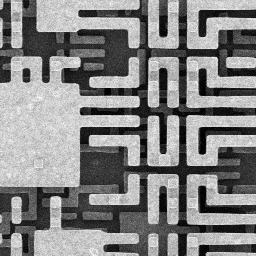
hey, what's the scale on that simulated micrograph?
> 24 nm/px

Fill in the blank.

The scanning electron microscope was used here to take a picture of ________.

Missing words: wiring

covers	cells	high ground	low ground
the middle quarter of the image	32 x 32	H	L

HHHHLLLLLLLLLLLLHHHLLHHHHHHHHLLH
LLLLLLLLLLLLLLLLHHHLLHHHLLHHHLLH
LLLLLLLLLLLLLLLLHHHLLHHHLLHHHLLH
LLLLLLLHHHHHHHHHHHHLLHHHLLHHHLLH
LLLLLLHHHHHHHHHHHHHLLHHHLLHHHLLH
HHHHLLLHHHHHHHHHHHHLLHHHLLHHHLLH
HHHHLLLLLLLLLLLLLLLLLHHHLLHHHLLH
HHHHLLLLLLLLLLLLLLLLLHHHLLHHHLLH
HHHHHHHHHHHHHHHHHHHLLHHHLLHHHLLH
HHHHHHHHHHHHHHHHHHHLLHHHLLHHHLLH
HHHHHHHHHHHHHHHHHHHLLHHHLLHHHLLH
HHHHLLLLLLLLLLLLLLLLLLLLLLLLLLLL
HHHHLLLLLLLLLLLLLLLLLLLLLLLLLLLL
HHHHHHHHHHHHHHHHHHHLLHHHLLHHHLLH
HHHHHHHHHHHHHHHHHHHLLHHHLLHHHLLH
HHHHHLLHHHHHHHHHHHLLLHHHLLHHHLLH
HHHHLLLLLLLLLLLLLLLLLHHHLLHHHLLH
HHHHLLLLLLLLLLLLLLLLLHHHLLHHHLLH
HHHHLLHHHHHHHHHHHHHLLHHHLLHHHLLH
HHHHLLHHHHHHHHHHHHHLLHHHLLHHHLLH
HHHHLLLLLLLLLLLHHHHLLHHHLLHHHLLH
HHHHLLLLLLLLLLLLHHHLLHHHLLHHHLLH
HHHHLLLLLLLLLLLLHHHLLHHHHHHHHLLH
HHHHLLLLLLLLLLLLHHHLLHHHHHHHHLLH
HHHHLLLLLLLLLLLLHHHLLHHHHHHHHLLH
HHHHLLLLLLLLLLLLLLLLLLLLLLLLLLLL
HHHHLLLLLLLLLLLLLLLLLLLLLLLLLLLL
HHHHLLLLLLLLLLLLLLLLLLLLLLLLLLLL
HHHHLLLLLLLLLLLLHHHLLHHHHHHHHLLH
HHHHLLLLLLLLLLLLHHHLLHHHHHHHHLLH
HHHLLLLLLLLLLLLLHHHLLHHHHHHHHLLH
LLLLLLLLLLLLLLLLHHHLLHHHLLHHHLLH